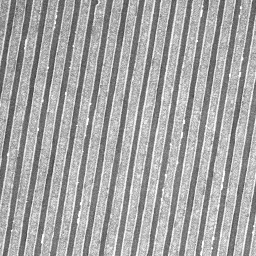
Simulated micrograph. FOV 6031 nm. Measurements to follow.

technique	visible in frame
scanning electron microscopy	parallel lines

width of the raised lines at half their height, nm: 221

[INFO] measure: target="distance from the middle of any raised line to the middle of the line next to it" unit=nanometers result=374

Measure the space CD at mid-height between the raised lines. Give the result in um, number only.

0.16